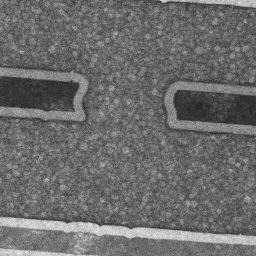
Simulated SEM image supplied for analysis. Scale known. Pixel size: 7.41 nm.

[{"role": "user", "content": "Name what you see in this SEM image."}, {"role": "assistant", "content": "one or a few lines or trenches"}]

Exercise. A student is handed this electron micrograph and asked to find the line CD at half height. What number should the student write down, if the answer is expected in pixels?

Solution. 38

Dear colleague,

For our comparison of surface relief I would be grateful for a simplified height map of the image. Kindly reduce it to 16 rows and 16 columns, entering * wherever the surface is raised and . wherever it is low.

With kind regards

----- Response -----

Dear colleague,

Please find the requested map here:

................
................
................
................
................
*****......**...
*****......*****
...........*****
................
................
................
................
................
................
********........
****************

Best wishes